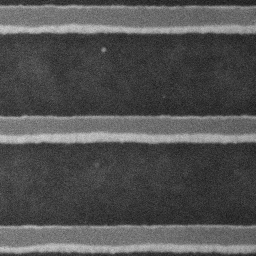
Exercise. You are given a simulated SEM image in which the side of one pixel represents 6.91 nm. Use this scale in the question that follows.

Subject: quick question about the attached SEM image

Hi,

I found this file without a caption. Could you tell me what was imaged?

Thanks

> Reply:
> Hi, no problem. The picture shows lines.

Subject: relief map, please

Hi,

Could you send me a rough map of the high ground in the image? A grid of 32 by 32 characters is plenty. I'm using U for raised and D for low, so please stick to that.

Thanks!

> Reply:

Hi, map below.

DDDDDDDDDDDDDDDDDDDDDDDDDDDDDDDD
UUUUUUUUUUUUUUUUUUUUUUUUUUUUUUUU
UUUUUUUUUUUUUUUUUUUUUUUUUUUUUUUU
UUUUUUUUUUUUUUUUUUUUUUUUUUUUUUUU
DDDDDDDDDDDDDDDDDDDDDDDDDDDDDDDD
DDDDDDDDDDDDDDDDDDDDDDDDDDDDDDDD
DDDDDDDDDDDDDDDDDDDDDDDDDDDDDDDD
DDDDDDDDDDDDDDDDDDDDDDDDDDDDDDDD
DDDDDDDDDDDDDDDDDDDDDDDDDDDDDDDD
DDDDDDDDDDDDDDDDDDDDDDDDDDDDDDDD
DDDDDDDDDDDDDDDDDDDDDDDDDDDDDDDD
DDDDDDDDDDDDDDDDDDDDDDDDDDDDDDDD
DDDDDDDDDDDDDDDDDDDDDDDDDDDDDDDD
DDDDDDDDDDDDDDDDDDDDDDDDDDDDDDDD
DDDDDDDDDDDDDDDDDDDDDDDDDDDDDDDD
UUUUUUUUUUUUUUUUUUUUUUUUUUUUUUUU
UUUUUUUUUUUUUUUUUUUUUUUUUUUUUUUU
UUUUUDDDDDDDDDDDDDUUUUDDDDDUUUDD
DDDDDDDDDDDDDDDDDDDDDDDDDDDDDDDD
DDDDDDDDDDDDDDDDDDDDDDDDDDDDDDDD
DDDDDDDDDDDDDDDDDDDDDDDDDDDDDDDD
DDDDDDDDDDDDDDDDDDDDDDDDDDDDDDDD
DDDDDDDDDDDDDDDDDDDDDDDDDDDDDDDD
DDDDDDDDDDDDDDDDDDDDDDDDDDDDDDDD
DDDDDDDDDDDDDDDDDDDDDDDDDDDDDDDD
DDDDDDDDDDDDDDDDDDDDDDDDDDDDDDDD
DDDDDDDDDDDDDDDDDDDDDDDDDDDDDDDD
DDDDDDDDDDDDDDDDDDDDDDDDDDDDDDDD
UUUUUUUUUUUUUUUUUUUUUUUUUUUUUUUU
UUUUUUUUUUUUUUUUUUUUUUUUUUUUUUUU
UUUUUUUUUUUUUUUUUUUUUUUUUUUUUUUU
DDDDDDDDDDDDDDDDDDDDDDDDDDDDDDDD